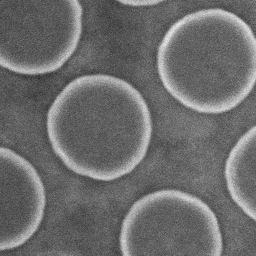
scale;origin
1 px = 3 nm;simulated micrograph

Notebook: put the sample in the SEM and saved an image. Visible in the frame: raised bodies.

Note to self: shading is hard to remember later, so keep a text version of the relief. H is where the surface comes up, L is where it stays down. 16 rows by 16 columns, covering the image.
HHHHHLLLLLLLLLLL
HHHHHLLLLLLHHHHL
HHHHHLLLLLHHHHHH
HHHHLLLLLLHHHHHH
LHHLLLLLLLHHHHHH
LLLLHHHHLLLHHHHH
LLLHHHHHHLLLHHHL
LLLHHHHHHLLLLLLL
LLLHHHHHHLLLLLLH
HLLLHHHHHLLLLLLH
HHLLLHHHLLLLLLHH
HHHLLLLLLLLLLLHH
HHHLLLLLLHHHLLLH
HHHLLLLLHHHHHLLL
HHLLLLLLHHHHHHLL
LLLLLLLLHHHHHHLL